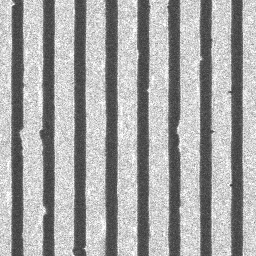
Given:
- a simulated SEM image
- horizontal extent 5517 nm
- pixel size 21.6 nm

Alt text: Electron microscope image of parallel lines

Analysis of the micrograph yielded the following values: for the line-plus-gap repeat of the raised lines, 676 nanometres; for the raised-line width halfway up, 442 nm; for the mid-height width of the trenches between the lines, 232 nanometres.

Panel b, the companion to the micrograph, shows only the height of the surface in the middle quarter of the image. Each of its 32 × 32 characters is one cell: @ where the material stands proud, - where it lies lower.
@@---@@@@@---@@@@@---@@@@@---@@@
@@@--@@@@@---@@@@@---@@@@@---@@@
@@@--@@@@@---@@@@@---@@@@@---@@@
@@@--@@@@@---@@@@@---@@@@@---@@@
@@@--@@@@@---@@@@@---@@@@@---@@@
@@@--@@@@@---@@@@@---@@@@@---@@@
@@@--@@@@@---@@@@@---@@@@@---@@@
@@@--@@@@@---@@@@@---@@@@@---@@@
@@@--@@@@@---@@@@@---@@@@@---@@@
@@@--@@@@@----@@@@---@@@@@---@@@
@@@--@@@@@----@@@@---@@@@@---@@@
@@@--@@@@@----@@@@---@@@@@---@@@
@@@--@@@@@@---@@@@---@@@@@---@@@
@@@--@@@@@@---@@@@---@@@@@---@@@
@@@--@@@@@@--@@@@@---@@@@@---@@@
@@@--@@@@@@--@@@@@---@@@@@--@@@@
@@@--@@@@@@--@@@@@---@@@@@--@@@@
@@@--@@@@@---@@@@@---@@@@@--@@@@
@@@--@@@@@---@@@@@---@@@@@---@@@
@@@--@@@@@---@@@@@---@@@@@---@@@
@@@--@@@@@---@@@@@---@@@@@---@@@
@@@--@@@@@---@@@@@---@@@@@---@@@
@@@--@@@@@---@@@@@---@@@@@---@@@
@@@--@@@@@---@@@@@---@@@@@---@@@
@@@--@@@@@---@@@@@---@@@@@---@@@
@@@--@@@@@---@@@@@---@@@@@---@@@
@@@--@@@@@---@@@@@---@@@@@---@@@
@@@--@@@@@---@@@@@---@@@@@---@@@
@@@--@@@@@---@@@@@---@@@@@---@@@
@@@--@@@@@---@@@@@---@@@@@---@@@
@@@--@@@@@---@@@@@---@@@@@---@@@
@@@--@@@@@---@@@@@---@@@@@---@@@